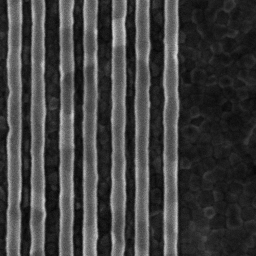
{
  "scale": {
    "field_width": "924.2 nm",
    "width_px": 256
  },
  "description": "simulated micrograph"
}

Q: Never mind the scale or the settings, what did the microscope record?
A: parallel lines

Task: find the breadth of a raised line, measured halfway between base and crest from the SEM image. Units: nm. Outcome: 46.9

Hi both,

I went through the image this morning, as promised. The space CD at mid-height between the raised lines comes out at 43.8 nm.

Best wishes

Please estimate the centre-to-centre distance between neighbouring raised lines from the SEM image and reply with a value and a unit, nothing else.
94.1 nm